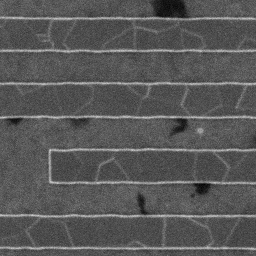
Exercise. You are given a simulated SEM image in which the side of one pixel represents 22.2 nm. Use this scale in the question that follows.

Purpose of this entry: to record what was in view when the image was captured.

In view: wiring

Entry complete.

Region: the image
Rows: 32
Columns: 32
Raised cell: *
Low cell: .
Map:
................................
................................
********************************
********************************
********************************
********************************
................................
................................
................................
................................
********************************
********************************
********************************
********************************
********************************
................................
................................
................................
................................
......**************************
......**************************
......**************************
......**************************
................................
................................
................................
................................
********************************
********************************
********************************
********************************
................................